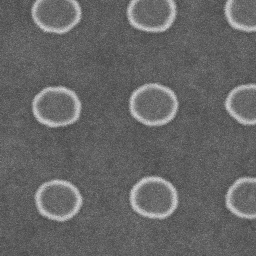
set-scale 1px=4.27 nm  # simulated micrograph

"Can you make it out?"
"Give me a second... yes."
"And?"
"raised bodies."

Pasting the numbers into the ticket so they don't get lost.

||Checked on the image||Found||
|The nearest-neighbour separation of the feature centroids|398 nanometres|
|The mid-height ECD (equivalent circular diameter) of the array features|175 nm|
